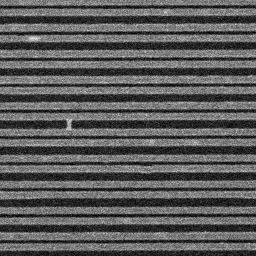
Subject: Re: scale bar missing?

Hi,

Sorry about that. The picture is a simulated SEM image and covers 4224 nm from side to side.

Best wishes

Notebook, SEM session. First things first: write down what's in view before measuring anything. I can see parallel lines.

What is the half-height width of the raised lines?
0.107 microns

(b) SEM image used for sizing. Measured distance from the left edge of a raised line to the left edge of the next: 215 nanometres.